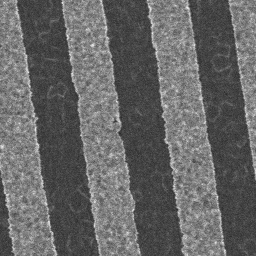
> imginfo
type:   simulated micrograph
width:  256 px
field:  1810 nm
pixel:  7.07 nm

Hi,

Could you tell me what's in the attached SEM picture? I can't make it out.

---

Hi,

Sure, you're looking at one or a few lines or trenches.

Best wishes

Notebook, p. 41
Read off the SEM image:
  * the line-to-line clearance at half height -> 43.4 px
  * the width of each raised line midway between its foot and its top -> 272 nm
